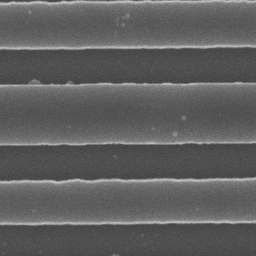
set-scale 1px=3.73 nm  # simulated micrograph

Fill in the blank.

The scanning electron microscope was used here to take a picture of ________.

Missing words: lines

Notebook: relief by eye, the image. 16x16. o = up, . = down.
oooooooooooooooo
oooooooooooooooo
oooooooooooooooo
................
................
oooooooooooooooo
oooooooooooooooo
oooooooooooooooo
oooooooooooooooo
................
................
oooooooooooooooo
oooooooooooooooo
oooooooooooooooo
................
................